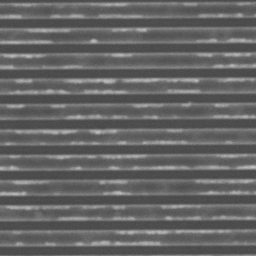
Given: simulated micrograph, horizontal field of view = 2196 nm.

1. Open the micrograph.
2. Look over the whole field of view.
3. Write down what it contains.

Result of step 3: parallel lines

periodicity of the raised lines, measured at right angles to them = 217 nm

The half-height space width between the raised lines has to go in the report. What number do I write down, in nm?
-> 90.1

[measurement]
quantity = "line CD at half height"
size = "131 nm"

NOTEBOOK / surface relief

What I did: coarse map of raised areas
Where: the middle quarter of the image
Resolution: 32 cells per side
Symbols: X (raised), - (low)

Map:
XXXXXXXXXXXXXXXXXXXXXXXXXXXXXXXX
--------------------------------
--------------------------------
--------------------------------
XXXXXXXXXXXXXXXXXXXXXXXXXXXXXXXX
XXXXXXXXXXXXXXXXXXXXXXXXXXXXXXXX
XXXXXXXXXXXXXXXXXXXXXXXXXXXXXXXX
--------------------------------
--------------------------------
--------------------------------
XXXXXXXXXXXXXXXXXXXXXXXXXXXXXXXX
XXXXXXXXXXXXXXXXXXXXXXXXXXXXXXXX
XXXXXXXXXXXXXXXXXXXXXXXXXXXXXXXX
XXXXXXXXXXXXXXXXXXXXXXXX--------
--------------------------------
--------------------------------
XXXXXX----XXXXXXXXXXXXXXXXXXXXXX
XXXXXXXXXXXXXXXXXXXXXXXXXXXXXXXX
XXXXXXXXXXXXXXXXXXXXXXXXXXXXXXXX
XXXXXXXXXXXXXXXXXXXXXXXXXXXXXXXX
--------------------------------
--------------------------------
--------------------------------
XXXXXXXXXXXXXXXXXXXXXXXXXXXXXXXX
XXXXXXXXXXXXXXXXXXXXXXXXXXXXXXXX
XXXXXXXXXXXXXXXXXXXXXXXXXXXXXXXX
--------------------------------
--------------------------------
--------------------------------
XXXXXXXXXXXXXXXXXXXXXXXXXXXXXXXX
XXXXXXXXXXXXXXXXXXXXXXXXXXXXXXXX
XXXXXXXXXXXXXXXXXXXXXXXXXXXXXXXX